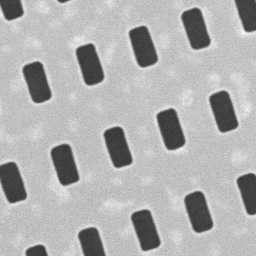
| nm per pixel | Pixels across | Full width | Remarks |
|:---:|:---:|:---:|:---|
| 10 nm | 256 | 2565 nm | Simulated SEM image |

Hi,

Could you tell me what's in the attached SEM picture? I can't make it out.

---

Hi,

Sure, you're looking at a regular array of holes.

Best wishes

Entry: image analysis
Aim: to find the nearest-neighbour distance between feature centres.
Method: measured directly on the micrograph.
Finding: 558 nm